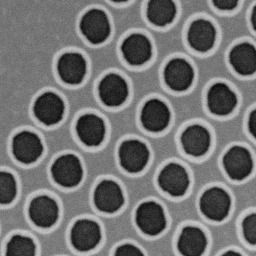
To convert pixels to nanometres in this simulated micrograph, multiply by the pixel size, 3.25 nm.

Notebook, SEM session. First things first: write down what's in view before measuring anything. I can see a regular array of holes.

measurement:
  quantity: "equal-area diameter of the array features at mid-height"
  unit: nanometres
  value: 114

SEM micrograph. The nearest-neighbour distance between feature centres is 148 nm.